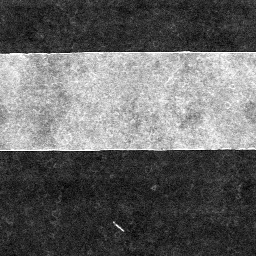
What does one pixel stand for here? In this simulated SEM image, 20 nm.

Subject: one or a few lines or trenches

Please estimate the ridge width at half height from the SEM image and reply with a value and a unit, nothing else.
1940 nanometers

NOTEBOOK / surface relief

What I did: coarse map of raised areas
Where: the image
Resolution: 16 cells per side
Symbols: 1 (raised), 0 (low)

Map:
0000000000000000
0000000000000000
0000000000000000
1111111111111111
1111111111111111
1111111111111111
1111111111111111
1111111111111111
1111111111111111
0000000000000000
0000000000000000
0000000000000000
0000000000000000
0000000000000000
0000000000000000
0000000000000000